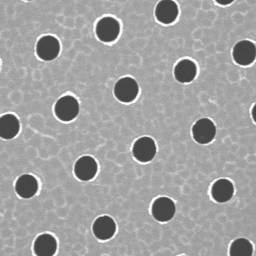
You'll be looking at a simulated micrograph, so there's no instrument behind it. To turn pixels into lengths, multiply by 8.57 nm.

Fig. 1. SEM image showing a regular array of holes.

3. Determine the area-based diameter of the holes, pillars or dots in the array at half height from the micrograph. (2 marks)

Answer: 206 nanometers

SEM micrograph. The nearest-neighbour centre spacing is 530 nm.